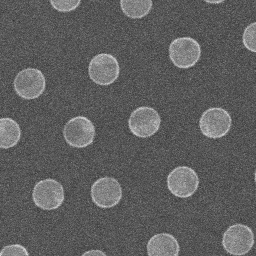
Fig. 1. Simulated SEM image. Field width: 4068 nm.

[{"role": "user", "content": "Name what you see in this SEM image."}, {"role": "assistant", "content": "a regular array of raised bodies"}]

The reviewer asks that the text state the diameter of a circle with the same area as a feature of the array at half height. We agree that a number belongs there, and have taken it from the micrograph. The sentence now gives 0.471 microns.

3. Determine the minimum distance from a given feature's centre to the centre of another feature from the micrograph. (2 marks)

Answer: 1060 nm